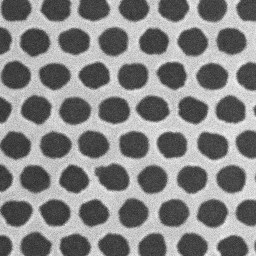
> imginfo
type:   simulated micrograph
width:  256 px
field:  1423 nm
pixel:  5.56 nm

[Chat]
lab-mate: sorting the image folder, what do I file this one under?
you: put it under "a regular array of holes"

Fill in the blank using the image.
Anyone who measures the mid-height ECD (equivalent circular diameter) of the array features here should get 165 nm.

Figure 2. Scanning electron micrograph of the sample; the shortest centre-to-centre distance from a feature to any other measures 212 nanometers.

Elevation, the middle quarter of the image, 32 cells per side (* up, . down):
*****.....****......****......**
.***.......***.......**.......**
..**........*........**........*
..**........*........***.......*
.***........**.......***......**
*****.....****......*****.....**
*******.********.***************
********************************
*...*******....*****.....*****..
......***.......***.......***...
.......*........**........**....
.......*.........*.........**...
.......*........***.......***...
......***.......***......****...
.....******....*******..*******.
********************************
******.*************************
****......*****.....****......**
.***.......***.......**.......**
..*........***.......**........*
..*........***.......**........*
..**.......***.......***.......*
.***......****.......***......**
*******..********..******..*****
********************************
*..******.*....******...******..
.....**.........****.....****...
......*.........**........**....
......**........**........**....
......***.......**........**....
......****......***.......***...
*....******....*****.....*****..